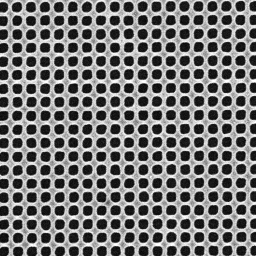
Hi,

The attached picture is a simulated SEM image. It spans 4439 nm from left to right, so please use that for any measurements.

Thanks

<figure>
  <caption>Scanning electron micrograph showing a regular array of holes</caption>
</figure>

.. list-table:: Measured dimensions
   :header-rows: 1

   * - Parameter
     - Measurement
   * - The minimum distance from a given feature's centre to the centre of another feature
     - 233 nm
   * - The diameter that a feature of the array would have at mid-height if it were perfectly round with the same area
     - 10.9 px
